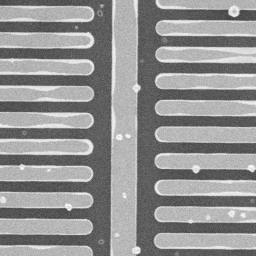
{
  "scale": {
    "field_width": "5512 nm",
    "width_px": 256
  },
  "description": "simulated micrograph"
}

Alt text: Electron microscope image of groups of lines, slits or small figures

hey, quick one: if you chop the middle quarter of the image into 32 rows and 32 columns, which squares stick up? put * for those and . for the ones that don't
*******.....******..............
*******.....******..............
******......******..............
............******.....*********
............******.....*********
............*******....*********
*******.....*******.............
*******.....******..............
*******.....******..............
............******......********
............******.....*********
............******.....*********
..****......******......********
*******.....******..............
*******.....******..............
*******.....******..............
............******.....*********
............******.....*********
............******.....*********
******......******..............
*******.....******..............
*******.....******..............
............******..............
............******.....*********
............******.....*********
............******.....*********
*******.....******..............
*******.....******..............
*******.....******..............
............******......********
............******.....*********
............******.....*********